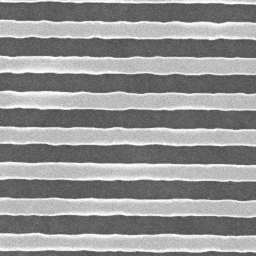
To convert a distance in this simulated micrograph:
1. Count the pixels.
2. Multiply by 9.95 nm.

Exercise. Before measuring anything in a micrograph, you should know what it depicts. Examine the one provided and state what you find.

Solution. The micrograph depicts wiring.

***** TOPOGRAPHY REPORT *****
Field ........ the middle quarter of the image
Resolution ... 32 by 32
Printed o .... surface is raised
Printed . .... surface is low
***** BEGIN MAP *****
oooooooooooooooooooooooooooooooo
oooooooooooooooooooooooooooooooo
.......................ooo....oo
................................
................................
................................
................................
ooooooooooooooooooo.oooooooooooo
oooooooooooooooooooooooooooooooo
oooooooooooooooooooooooooooooooo
oooooooooooooooooooooooooooooooo
................................
................................
................................
................................
................................
oooooooooooooooooooooooooooo.o..
oooooooooooooooooooooooooooooooo
oooooooooooooooooooooooooooooooo
oooooooooooooooooooooooooooooooo
................................
................................
................................
................................
................................
oooooooooooooooooooooooooooooooo
oooooooooooooooooooooooooooooooo
oooooooooooooooooooooooooooooooo
oooooooooooooooooooooooooooooooo
................................
................................
................................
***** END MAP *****